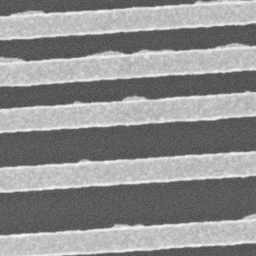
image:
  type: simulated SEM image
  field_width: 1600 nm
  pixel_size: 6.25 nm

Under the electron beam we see lines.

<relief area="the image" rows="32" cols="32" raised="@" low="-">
--------------------------@@@@@@
----------@@@@@@@@@@@@@@@@@@@@@@
@@@@@@@@@@@@@@@@@@@@@@@@@@@@@@@@
@@@@@@@@@@@@@@@@@@@@@@@---------
@@@@@@@-------------------------
--------------------------------
----------------------@@@@@@@@@@
@-----@@@@@@@@@@@@@@@@@@@@@@@@@@
@@@@@@@@@@@@@@@@@@@@@@@@@@@@@@@@
@@@@@@@@@@@@@@@@@@@@------------
@@@@@---------------------------
--------------------------------
-------------------@@@@@@@@@@@@@
---@@@@@@@@@@@@@@@@@@@@@@@@@@@@@
@@@@@@@@@@@@@@@@@@@@@@@@@@@@@@@-
@@@@@@@@@@@@@@@@@@--------------
@-------------------------------
--------------------------------
--------------------------------
-----------------------@@@@@@@@@
---------@@@@@@@@@@@@@@@@@@@@@@@
@@@@@@@@@@@@@@@@@@@@@@@@@@@@@@@@
@@@@@@@@@@@@@@@@@@@@@@----------
@@@@@@@@@-----------------------
--------------------------------
--------------------------------
--------------------------------
-------------------------------@
---------------@@@@@@@@@@@@@@@@@
-@@@@@@@@@@@@@@@@@@@@@@@@@@@@@@@
@@@@@@@@@@@@@@@@@@@@@@@@@@@@@@--
@@@@@@@@@@@@@-------------------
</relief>